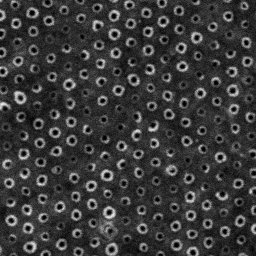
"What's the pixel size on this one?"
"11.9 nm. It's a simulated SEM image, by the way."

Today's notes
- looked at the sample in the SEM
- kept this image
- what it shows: a regular array of holes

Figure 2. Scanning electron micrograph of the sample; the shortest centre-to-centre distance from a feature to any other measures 218 nm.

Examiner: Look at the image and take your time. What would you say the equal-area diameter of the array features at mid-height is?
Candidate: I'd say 6.18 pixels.